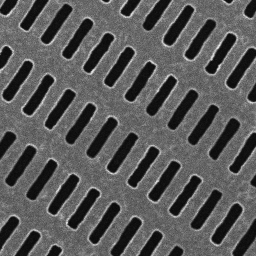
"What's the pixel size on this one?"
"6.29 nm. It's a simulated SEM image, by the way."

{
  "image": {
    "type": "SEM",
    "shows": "a regular array of holes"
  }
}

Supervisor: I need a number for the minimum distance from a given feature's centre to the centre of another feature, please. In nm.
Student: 159